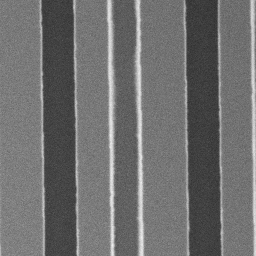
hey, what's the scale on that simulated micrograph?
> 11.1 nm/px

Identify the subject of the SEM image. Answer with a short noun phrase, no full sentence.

lines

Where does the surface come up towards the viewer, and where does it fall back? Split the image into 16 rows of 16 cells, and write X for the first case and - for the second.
XXX--XXXXXXX--XX
XXX--XXXXXXX--XX
XXX--XXXXXXX--XX
XXX--XXXXXXX--XX
XXX--XXXXXXX--XX
XXX--XXXXXXX--XX
XXX--XXXXXXX--XX
XXX--XXXXXXX--XX
XXX--XXXXXXX--XX
XXX--XXXXXXX--XX
XXX--XXXXXXX--XX
XXX--XXXXXXX--XX
XXX--XXXXXXX--XX
XXX--XXXXXXX--XX
XXX--XXXXXXX--XX
XXX--XXXXXXX--XX